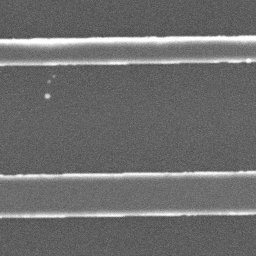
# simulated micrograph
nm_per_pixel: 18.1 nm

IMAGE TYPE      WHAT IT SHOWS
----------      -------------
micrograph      lines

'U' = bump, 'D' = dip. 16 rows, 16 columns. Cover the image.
DDDDDDDDDDDDDDDD
DDDDDDDDDDDDDDDD
UUUUUUUUUUUUUUUU
UUUUUUUUUUUUUUUU
DDDDDDDDDDDDDDDD
DDDDDDDDDDDDDDDD
DDDDDDDDDDDDDDDD
DDDDDDDDDDDDDDDD
DDDDDDDDDDDDDDDD
DDDDDDDDDDDDDDDD
DDDDDDDDDDDDDDDD
UUUUUUUUUUUUUUUU
UUUUUUUUUUUUUUUU
UUUUDDDDDDDDDDDD
DDDDDDDDDDDDDDDD
DDDDDDDDDDDDDDDD